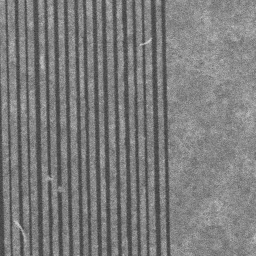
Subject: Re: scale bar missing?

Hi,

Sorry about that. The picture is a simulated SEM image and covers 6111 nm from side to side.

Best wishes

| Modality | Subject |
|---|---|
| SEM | parallel lines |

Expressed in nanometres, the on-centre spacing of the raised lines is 233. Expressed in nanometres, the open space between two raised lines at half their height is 98.4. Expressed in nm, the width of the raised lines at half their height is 137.